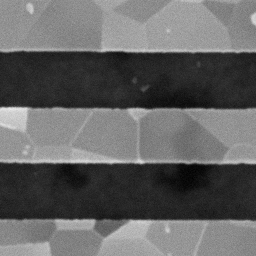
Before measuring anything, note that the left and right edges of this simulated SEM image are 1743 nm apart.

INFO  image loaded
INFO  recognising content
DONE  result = lines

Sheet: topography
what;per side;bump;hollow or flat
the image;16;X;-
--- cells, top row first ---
XXXXXXXXXXXXXXXX
XXXXXXXXXXXXXXXX
XXXXXXXXXXXXXXXX
----------------
----------------
----------------
----------------
XXXXXXXXXXXXXXXX
XXXXXXXXXXXXXXXX
XXXXXXXXXXXXXXXX
----------------
----------------
----------------
----------------
XXXXXXXXXXXXXXXX
XXXXXXXXXXXXXXXX